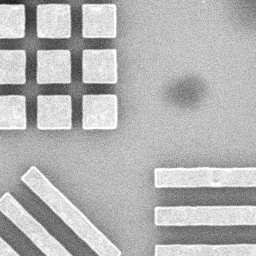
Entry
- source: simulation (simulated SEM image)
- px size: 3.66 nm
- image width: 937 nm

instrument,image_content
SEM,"groups of lines, slits or small figures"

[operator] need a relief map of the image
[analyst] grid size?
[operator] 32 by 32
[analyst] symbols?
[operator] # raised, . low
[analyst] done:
................................
###..####.####..................
###..####.####..................
###..####.####..................
###..###...###..................
................................
###..###...###..................
###..####.####..................
###..####.####..................
###..####.####..................
................................
................................
###..####.####..................
###..####.####..................
###..####.####..................
###..####.####..................
................................
................................
................................
................................
................................
...##..............#############
...###.............#############
....###.........................
.....###........................
##....###.......................
###....###.........#############
.###....###........#############
..###....###....................
....##....###...................
#...###....###..................
##....##....###....#############